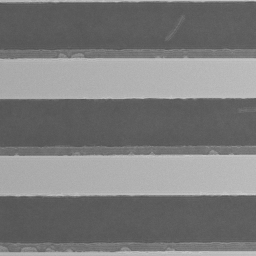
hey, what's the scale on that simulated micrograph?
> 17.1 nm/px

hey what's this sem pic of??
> lines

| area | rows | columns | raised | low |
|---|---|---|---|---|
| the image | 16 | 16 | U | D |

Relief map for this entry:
DDDDDDDDDDDDDDDD
DDDDDDDDDDDDDDDD
DDDDDDDDDDDDDDDD
UUUUUUUUUUUUUUUU
UUUUUUUUUUUUUUUU
UUUUUUUUUUUUUUUU
DDDDDDDDDDDDDDDD
DDDDDDDDDDDDDDDD
DDDDDDDDDDDDDDDD
UUUUUUUUUUUUUUUU
UUUUUUUUUUUUUUUU
UUUUUUUUUUUUUUUU
DDDDDDDDDDDDDDDD
DDDDDDDDDDDDDDDD
DDDDDDDDDDDDDDDD
UUUUUUUUUUUUUUUU